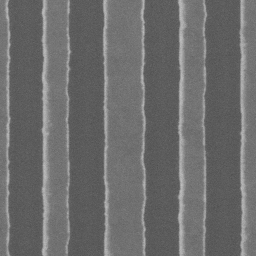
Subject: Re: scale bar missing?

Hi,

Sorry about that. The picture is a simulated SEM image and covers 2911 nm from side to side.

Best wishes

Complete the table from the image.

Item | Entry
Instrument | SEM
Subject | lines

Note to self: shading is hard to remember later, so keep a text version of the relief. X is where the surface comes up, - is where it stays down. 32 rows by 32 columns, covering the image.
X----XXXX----XXXXX----XXXX----XX
X----XXXX----XXXXX-----XXX----XX
X----XXX-----XXXXX-----XXX----XX
X----XXX-----XXXXX-----XXX----XX
X----XXXX----XXXXX-----XXX----XX
X----XXXX----XXXXX-----XXX----XX
X-----XXX----XXXXX-----XXX----XX
X-----XXX----XXXXX-----XXX----XX
X-----XXX----XXXXX-----XXX----XX
X----XXX-----XXXXX-----XXX----XX
X----XXX-----XXXXX-----XXX----XX
X----XXX-----XXXXX-----XXX----XX
X----XXXX----XXXXX----XXXX----XX
X-----XX-----XXXXX----XXXX----XX
X-----XX-----XXXXX----XXXX----XX
X-----XX-----XXXXX----XXXX----XX
X-----XX-----XXXXX----XXXX----XX
X-----XX-----XXXXX----XXXX----XX
X-----XX-----XXXXX-----XXX----XX
X----XXX-----XXXXX-----XXX----XX
X-----XXX----XXXXX-----XXX----XX
X-----XXX----XXXXX-----XXX----XX
X-----XXX----XXXXX-----XXX----XX
X----XXXX----XXXXX-----XXX----XX
X-----XX-----XXXXX----XXXX----XX
X-----XX-----XXXXX----XXXX----XX
X-----XX-----XXXXX----XXXX----XX
X-----XXX----XXXXX----XXXX----XX
X-----XXX----XXXXX----XXXX----XX
X-----XXX----XXXXX-----XXX----XX
X-----XX-----XXXXX-----XXX----XX
X----XXX-----XXXXX-----XXX----XX